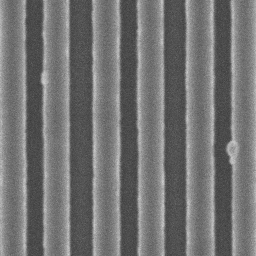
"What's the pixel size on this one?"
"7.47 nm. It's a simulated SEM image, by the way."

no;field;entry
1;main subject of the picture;lines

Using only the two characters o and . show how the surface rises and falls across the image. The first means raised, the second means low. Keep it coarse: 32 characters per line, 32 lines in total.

ooo...ooo...ooo..ooo...oooo..ooo
ooo...ooo...ooo..ooo...oooo..ooo
ooo...ooo...ooo..ooo...oooo..ooo
ooo...ooo...ooo..ooo...oooo..ooo
ooo...ooo...ooo..ooo...oooo..ooo
ooo...ooo...ooo..ooo...oooo..ooo
ooo...ooo...ooo..ooo...oooo..ooo
ooo...ooo...ooo..ooo...oooo..ooo
ooo..oooo...ooo..ooo...oooo..ooo
ooo..oooo...ooo..ooo...oooo..ooo
ooo..oooo...ooo..ooo...oooo..ooo
ooo...ooo...ooo..ooo...oooo..ooo
ooo...ooo...ooo..ooo...oooo..ooo
ooo...ooo...ooo..ooo...oooo..ooo
ooo...ooo...ooo..ooo...oooo..ooo
ooo...ooo...ooo..ooo...oooo..ooo
ooo...ooo...ooo..ooo...oooo..ooo
ooo...ooo...ooo..ooo...oooo..ooo
ooo...ooo...ooo..ooo...oooo.oooo
ooo...ooo...ooo..ooo...oooo..ooo
ooo...ooo...ooo..ooo...oooo..ooo
ooo...ooo...ooo..ooo...oooo..ooo
ooo...ooo...ooo..ooo...oooo..ooo
ooo...ooo...ooo..ooo...oooo..ooo
ooo...ooo...ooo..ooo...oooo..ooo
ooo...ooo...ooo..ooo...oooo..ooo
ooo...ooo...ooo..ooo...oooo..ooo
ooo...ooo...ooo..ooo...oooo..ooo
ooo...ooo...ooo..ooo...oooo..ooo
ooo...ooo...ooo..ooo...oooo..ooo
ooo...ooo...ooo..ooo...oooo..ooo
ooo...ooo...ooo..ooo...oooo..ooo